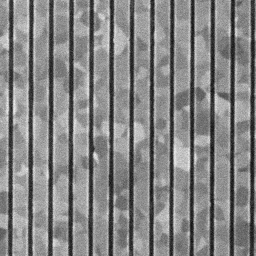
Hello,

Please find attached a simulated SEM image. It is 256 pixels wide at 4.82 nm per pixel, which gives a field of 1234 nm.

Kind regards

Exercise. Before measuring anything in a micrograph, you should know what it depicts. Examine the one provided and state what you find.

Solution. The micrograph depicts parallel lines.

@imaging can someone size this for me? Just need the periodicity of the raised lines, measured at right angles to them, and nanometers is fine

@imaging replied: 97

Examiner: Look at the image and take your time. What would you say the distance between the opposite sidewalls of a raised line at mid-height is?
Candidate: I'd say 69.8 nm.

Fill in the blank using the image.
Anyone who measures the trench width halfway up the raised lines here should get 24.7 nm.